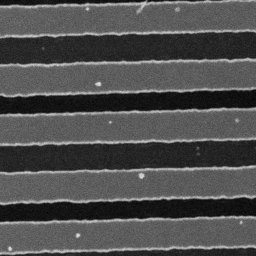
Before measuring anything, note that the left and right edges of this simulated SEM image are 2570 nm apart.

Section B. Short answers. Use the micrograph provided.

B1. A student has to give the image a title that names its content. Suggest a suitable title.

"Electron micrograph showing lines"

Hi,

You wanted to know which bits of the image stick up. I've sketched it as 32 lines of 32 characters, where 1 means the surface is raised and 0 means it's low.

00000000000011111111111111111111
11111111111111111111111111111111
11111111111111111111111111111111
11111111111111111111111111111111
11111010000000000000000000000000
00000000000000000000000000000000
00000000000000000000000000000000
00000000000000000000001001011111
11111111111111111111111111111111
11111111111111111111111111111111
11111111111111111111111111111111
11111111111111111111101000000000
00000000000000000000000000000000
00000000000000000000000000011101
11111111111111111111111111111111
11111111111111111111111111111111
11111111111111111111111111111111
11111111111111111111111111111100
00000000000000000000000000000000
00000000000000000000000000000000
00000000000000000000000000000000
00010111111111111111111111111111
11111111111111111111111111111111
11111111111111111111111111111111
11111111111111111111111111111111
11000000000000000000000000000000
00000000000000000000000000000000
00000000000000111111111111111111
11111111111111111111111111111111
11111111111111111111111111111111
11111111111111111111111111111111
11111111000000000000000000000000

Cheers